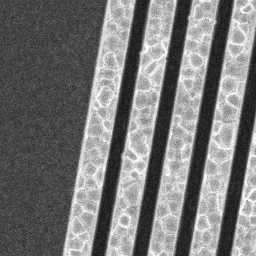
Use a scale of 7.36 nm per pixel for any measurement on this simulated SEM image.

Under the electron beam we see parallel lines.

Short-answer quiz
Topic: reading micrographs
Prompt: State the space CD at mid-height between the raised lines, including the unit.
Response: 0.109 micrometres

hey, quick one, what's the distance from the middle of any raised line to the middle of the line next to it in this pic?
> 302 nm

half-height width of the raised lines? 0.191 microns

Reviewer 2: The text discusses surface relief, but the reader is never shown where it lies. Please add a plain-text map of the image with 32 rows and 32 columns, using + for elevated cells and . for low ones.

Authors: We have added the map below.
.............++++..+++..+++..+++
.............++++..+++..+++..+++
.............+++..++++..+++..+++
.............+++..+++..++++..+++
.............+++..+++..++++.++++
.............+++..+++..+++..++++
.............+++..+++..+++..+++.
............++++.++++..+++..+++.
............+++..++++..+++..+++.
............+++..+++..++++..+++.
............+++..+++..++++.++++.
............+++..+++..+++..++++.
...........++++..+++..+++..+++..
...........++++.++++..+++..+++..
...........+++..++++..+++..+++..
...........+++..+++..++++..+++..
...........+++..+++..+++..++++..
...........+++..+++..+++..++++.+
..........++++..+++..+++..+++..+
..........+++..++++..+++..+++..+
..........+++..+++..++++..+++..+
..........+++..+++..++++.++++..+
..........+++..+++..+++..++++..+
..........+++..+++..+++..+++..++
.........++++.++++..+++..+++..++
.........+++..++++..+++..+++..++
.........+++..+++..++++..+++..++
.........+++..+++..++++.++++..++
.........+++..+++..+++..++++..++
........++++..+++..+++..+++..+++
........++++.++++..+++..+++..+++
........+++..++++..+++..+++..+++